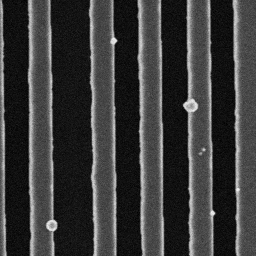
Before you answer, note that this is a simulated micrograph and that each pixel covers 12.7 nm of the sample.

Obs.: lines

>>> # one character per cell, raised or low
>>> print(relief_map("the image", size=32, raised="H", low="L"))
LLLLHHLLLLLHHHLLLHHHLLLHHHLLLHHH
LLLLHHLLLLLHHHLLLHHHLLLHHHLLLHHH
LLLLHHLLLLLHHHLLLHHHLLLHHHLLLHHH
LLLLHHLLLLLHHHLLLHHHLLLHHHLLLHHH
LLLLHHLLLLLHHHLLLHHHLLLHHHLLLHHH
LLLLHHLLLLLHHHLLLHHHLLLHHHLLLHHH
LLLLHHLLLLLHHHLLLHHHLLLHHHLLLHHH
LLLLHHLLLLLHHHLLLHHHLLLHHHLLLHHH
LLLLHHLLLLLHHHLLLHHHLLLHHHLLLHHH
LLLLHHLLLLLHHHLLLHHHLLLLHHLLLHHH
LLLLHHLLLLLHHHLLLLHHLLLLHHLLLHHH
LLLLHHLLLLLHHHLLLLHHLLLLHHLLLHHH
LLLLHHLLLLLLHHLLLLHHLLLHHHLLLLHH
LLLLHHLLLLLHHHLLLLHHLLLHHHLLLHHH
LLLLHHLLLLLHHHLLLLHHLLLLHHLLLHHH
HLLLHHLLLLLHHHLLLLHHLLLLHHLLLHHH
HLLLHHLLLLLLHHLLLLHHLLLLHHLLLLHH
HLLLHHLLLLLLHHLLLLHHLLLLHHLLLLHH
HLLLHHHLLLLLHHLLLLHHLLLLHHLLLLHH
HLLLHHLLLLLLHHLLLLHHLLLLHHLLLLHH
HLLLHHHLLLLLHHLLLLHHLLLLHHLLLLHH
HLLLHHHLLLLLHHLLLLHHLLLLHHLLLLHH
HLLLHHHLLLLHHHLLLLHHLLLLHHLLLLHH
HLLLHHHLLLLLHHLLLLHHLLLLHHLLLLHH
HLLLHHHLLLLLHHLLLLHHLLLLHHLLLLHH
HLLLHHHLLLLLHHLLLLHHLLLLHHLLLLHH
HLLLHHHLLLLLHHLLLLHHLLLLHHHLLLHH
HLLLHHHLLLLLHHLLLLHHLLLLHHHLLLHH
HLLLHHHLLLLLHHLLLLHHLLLLHHHLLLHH
HLLLHHHLLLLLHHLLLLHHLLLLHHHLLLHH
HLLLHHHLLLLLHHLLLLHHLLLLHHHLLLHH
HLLLHHHLLLLLHHLLLLHHLLLLHHHLLLHH